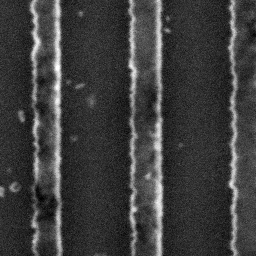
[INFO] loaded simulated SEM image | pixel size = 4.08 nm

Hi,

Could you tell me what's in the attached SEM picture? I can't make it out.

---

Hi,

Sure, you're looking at lines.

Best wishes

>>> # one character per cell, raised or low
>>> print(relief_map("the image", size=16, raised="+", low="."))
..++....++....++
..++....++....++
..++....++....++
..++....++....++
..++....++.....+
..++....++.....+
..++....++....++
..++....++.....+
..++....++.....+
..++....++.....+
..++....++.....+
..++....++....++
..++....++.....+
..++....++.....+
..++....++.....+
..++....++.....+